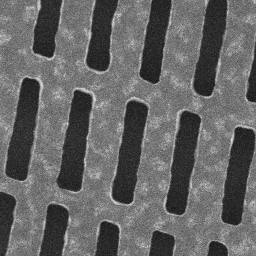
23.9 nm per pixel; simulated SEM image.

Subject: holes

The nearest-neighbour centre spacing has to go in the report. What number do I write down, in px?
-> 53.7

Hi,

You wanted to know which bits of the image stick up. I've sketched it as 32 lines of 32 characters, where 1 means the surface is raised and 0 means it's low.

11111000111100011110011111001111
11111000111100111110011111001111
11111001111000111110011111001111
11110001111000111100011110001111
11110001111000111100011110001111
11110001111000111100011110001111
11110001111000111100111110001111
11111111111000111100111110011111
11111111111001111100111100011110
11111111111111111100111100011110
11100111111111111111111100011110
11000111100111111111111100011110
11000111100011110111111111111110
11000111100011110001111111111111
11000111100111110011111001111111
11000111100111100011110001111111
11001111000111100011110001111000
10001111000111100011110001111000
10001111000111100011110001111000
10001111000111100011110001111000
10001111000111100111110011111001
10001110000111100111100011110001
11011110001111000111100011110001
11111111001111000111100011110001
00111111111111000111100011110001
00111101111111101111100111110001
00111100011111111111100111110011
00111100011111111111111111110011
01111100111100011111111111111111
01111000111100011110001111111111
01111000111100011110001111001111
01111000111100011110001111000111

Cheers